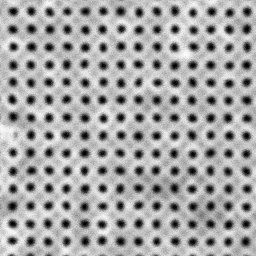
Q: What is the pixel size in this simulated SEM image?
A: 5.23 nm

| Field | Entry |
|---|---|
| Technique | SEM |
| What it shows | a regular array of holes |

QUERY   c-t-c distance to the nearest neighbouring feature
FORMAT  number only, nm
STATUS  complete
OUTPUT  90.2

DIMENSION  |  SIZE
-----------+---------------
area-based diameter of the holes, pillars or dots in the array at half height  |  54.1 nm